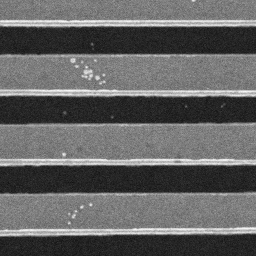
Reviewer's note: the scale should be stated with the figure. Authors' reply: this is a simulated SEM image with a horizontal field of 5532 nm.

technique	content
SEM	lines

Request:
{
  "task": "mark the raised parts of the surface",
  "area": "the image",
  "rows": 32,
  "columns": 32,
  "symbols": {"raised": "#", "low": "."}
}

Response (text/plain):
################################
################################
################################
................................
................................
................................
................................
################################
################################
################################
################################
################################
................................
................................
................................
.............................#.#
################################
################################
################################
################################
################################
................................
................................
................................
################################
################################
################################
################################
################################
................................
................................
................................